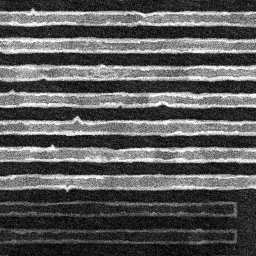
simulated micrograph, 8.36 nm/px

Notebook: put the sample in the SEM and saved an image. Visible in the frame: parallel lines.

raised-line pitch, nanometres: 228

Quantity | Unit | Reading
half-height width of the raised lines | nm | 114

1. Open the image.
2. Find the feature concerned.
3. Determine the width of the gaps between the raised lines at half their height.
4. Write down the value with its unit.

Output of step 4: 0.114 micrometres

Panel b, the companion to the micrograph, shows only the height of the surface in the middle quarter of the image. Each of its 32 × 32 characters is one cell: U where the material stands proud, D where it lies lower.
DDDDDDDDDUUDDDDDDDDDDDDDDDDDDDDD
UUUUUUUUUUUUUUUUUUUUUUUUUUUUUUUU
UUUUUUUUUUUUUUUUUUUUUUUUUUUUUUUU
UUUUUUUUUUUUUUUUUUUUUUUUUUUUUUUU
DDDDDDDDDDDDDDDDDDDDDDDDDDDDDDDD
DDDDDDDDDDDDDDDDDDDDDDDDDDDDDDDD
DDDDDDDDDDDDDDDDDDDDDDDDDDDDDDDD
DDDDDDDDDDDUUUUUDDDDDDDDDDUUUUUD
UUUUUUUUUUUUUUUUUUUUUUUUUUUUUUUU
UUUUUUUUUUUUUUUUUUUUUUUUUUUUUUUU
DUUUUUUUUDDUUUUUUUUUDDDDDDUUUUUU
DDDDDDDDDDDDDDDDDDDDDDDDDDDDDDDD
DDDDDDDDDDDDDDDDDDDDDDDDDDDDDDDD
DDDUDDDDDDDDDDDDDDDDDDDDDDDDDDDD
DUUUUUDDDDUUUUUUUUUUUUUUUUUUUUUU
UUUUUUUUUUUUUUUUUUUUUUUUUUUUUUUU
UUUUUUUUUUUUUUUUUUUUUUUUUUUUUUUU
UUUUUUUUUUUDUDUUUUUUUUUUUUUUUUUU
DDDDDDDDDDDDDDDDDDDDDDDDDDDDDDDD
DDDDDDDDDDDDDDDDDDDDDDDDDDDDDDDD
DDDDDDDDDDDDDDDDDDDDDDDDDDDDDDDD
UUUUUUUUUUUUUUUUUUUUUUUUUUUUUUUU
UUUUUUUUUUUUUUUUUUUUUUUUUUUUUUUU
UUUUUUUUUUUUUUUUUUUUUUUUUUUUUUUU
DDDDDDDDDDDDDDDDDDDDDDDDDDDDDDDD
DDDDDDDDDDDDDDDDDDDDDDDDDDDDDDDD
DDDDDDDDDDDDDDDDDDDDDDDDDDDDDDDD
DDDDDDDDDDDDDDDDDDDDDDDDDDDDDDDD
UUUUUUUUUUUUUUUUUUUUUUUUUUUUUUUU
UUUUUUUUUUUUUUUUUUUUUUUUUUUUUUUU
UUUUUUUUUUUUUUUUUUUUUUUUUUUUUUUU
DDDDDDDDDDDDDDDDDDDDDDDDDDDDDDDD